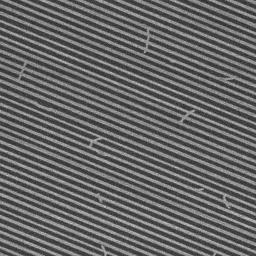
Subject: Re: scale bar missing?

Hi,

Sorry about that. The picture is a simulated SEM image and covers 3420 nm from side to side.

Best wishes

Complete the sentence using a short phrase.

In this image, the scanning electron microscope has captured parallel lines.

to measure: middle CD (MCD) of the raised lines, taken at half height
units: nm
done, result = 35.7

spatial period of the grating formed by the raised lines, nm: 93.6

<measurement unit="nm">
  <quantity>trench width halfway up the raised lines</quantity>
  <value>60.4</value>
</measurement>